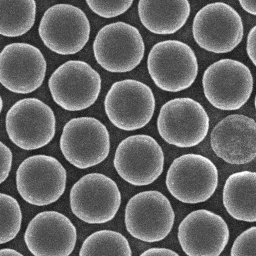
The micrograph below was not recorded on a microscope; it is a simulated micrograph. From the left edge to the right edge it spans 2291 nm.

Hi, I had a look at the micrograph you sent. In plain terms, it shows a regular array of raised bodies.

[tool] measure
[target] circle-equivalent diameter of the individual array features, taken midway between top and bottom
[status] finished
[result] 0.446 microns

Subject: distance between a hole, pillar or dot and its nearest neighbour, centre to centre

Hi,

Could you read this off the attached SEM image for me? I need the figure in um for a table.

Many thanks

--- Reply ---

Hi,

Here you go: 0.509